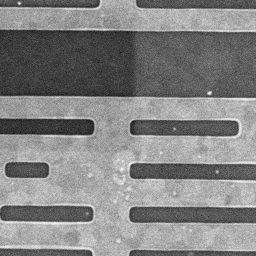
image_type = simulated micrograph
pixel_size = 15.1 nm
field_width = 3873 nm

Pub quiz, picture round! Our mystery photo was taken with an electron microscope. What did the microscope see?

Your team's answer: groups of lines, slits or small figures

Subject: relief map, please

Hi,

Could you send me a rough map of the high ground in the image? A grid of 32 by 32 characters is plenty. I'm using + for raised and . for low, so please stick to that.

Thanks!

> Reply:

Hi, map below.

.............++++...............
++++++++++++++++++++++++++++++++
++++++++++++++++++++++++++++++++
++++++++++++++++++++++++++++++++
................................
................................
................................
................................
................................
................................
................................
................................
++++++++++++++++++++++++++++++++
++++++++++++++++++++++++++++++++
++++++++++++++++++++++++++++++++
............++++..............++
............++++..............++
++++++++++++++++++++++++++++++++
++++++++++++++++++++++++++++++++
++++++++++++++++++++++++++++++++
+.....+++++++++++...............
+.....++++++++++................
++++++++++++++++++++++++........
++++++++++++++++++++++++++++++++
++++++++++++++++++++++++++++++++
++++++++++++++++++++++++++++++++
............++++................
...........+++++................
++++++++++++++++++++++++++++++++
++++++++++++++++++++++++++++++++
++++++++++++++++++++++++++++++++
...........+++++................